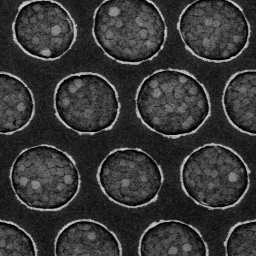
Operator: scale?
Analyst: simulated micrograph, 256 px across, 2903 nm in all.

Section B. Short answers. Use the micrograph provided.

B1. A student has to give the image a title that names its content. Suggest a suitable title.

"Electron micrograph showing holes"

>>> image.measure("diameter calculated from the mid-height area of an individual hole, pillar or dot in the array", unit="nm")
724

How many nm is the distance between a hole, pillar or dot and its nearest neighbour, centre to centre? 966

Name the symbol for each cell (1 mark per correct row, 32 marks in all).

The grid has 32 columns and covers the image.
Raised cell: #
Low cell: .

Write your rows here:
####...######......#####.....###
##......####..#.....###.......##
##.......###........###........#
##.......###.........##........#
##.......###........###........#
##.......###........###........#
###.....#####.......####......##
###############...#########.####
################################
.#########..#######.....#####...
...#####.#....####.......####...
....###.......###.........##....
....###........##.........##....
....###........##.........##....
....###........###........###...
...#####......####.......####...
.#########..########....#######.
################################
####...##################...####
##......######.....#####......##
##.......####.......###.......##
##........##........###........#
#.........##........###........#
##........###.......###........#
##.......#####.....#####......##
###.....#######...#######....###
################################
################################
..######.....######.....#####...
...####.......####.......####...
....###........###........##....
....###........###........##....